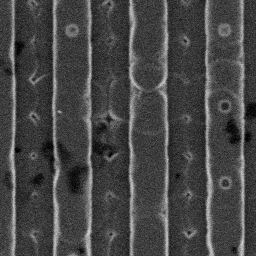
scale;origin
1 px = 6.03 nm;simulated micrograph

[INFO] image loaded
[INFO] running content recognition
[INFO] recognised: wiring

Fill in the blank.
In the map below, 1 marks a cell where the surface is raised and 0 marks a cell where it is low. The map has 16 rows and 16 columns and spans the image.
1001110011000110
1001110011000110
1001110011000110
1001110011000110
1001110011000110
1001110011000110
1001110011000110
1001110011000110
1001110011000110
1001110011000110
1000110011000110
1001110011000110
1001110011000110
1001110011000110
1001110011000110
1001110011000110